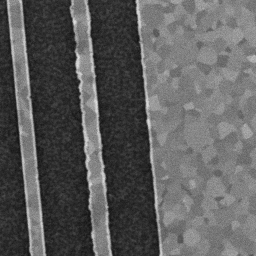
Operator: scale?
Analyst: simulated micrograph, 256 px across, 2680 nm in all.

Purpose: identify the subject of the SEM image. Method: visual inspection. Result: one or a few lines or trenches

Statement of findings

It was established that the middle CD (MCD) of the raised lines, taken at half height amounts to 0.134 microns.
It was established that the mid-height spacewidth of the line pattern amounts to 51.2 px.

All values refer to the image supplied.